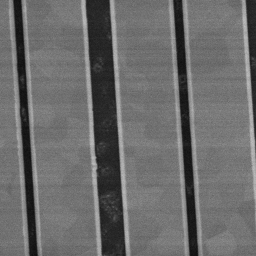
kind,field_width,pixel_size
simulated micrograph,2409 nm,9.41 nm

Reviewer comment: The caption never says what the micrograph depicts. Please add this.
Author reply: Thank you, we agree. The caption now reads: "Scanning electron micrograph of one or a few lines or trenches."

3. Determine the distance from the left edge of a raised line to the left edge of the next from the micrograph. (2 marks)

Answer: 774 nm